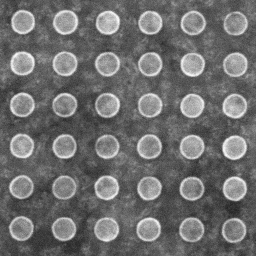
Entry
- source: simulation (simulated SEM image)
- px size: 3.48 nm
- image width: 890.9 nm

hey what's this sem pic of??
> a regular array of raised bodies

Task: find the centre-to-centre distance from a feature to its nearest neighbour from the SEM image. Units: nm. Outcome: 144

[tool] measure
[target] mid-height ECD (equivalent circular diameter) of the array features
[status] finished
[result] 80.2 nm